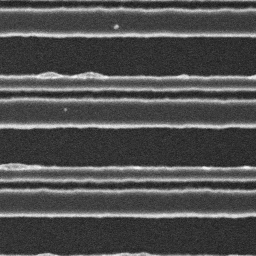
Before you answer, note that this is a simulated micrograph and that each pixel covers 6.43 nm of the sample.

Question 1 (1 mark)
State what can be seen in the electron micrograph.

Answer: lines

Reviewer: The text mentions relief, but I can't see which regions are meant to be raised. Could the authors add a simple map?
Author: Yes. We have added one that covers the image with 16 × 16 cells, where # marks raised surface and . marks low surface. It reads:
################
################
................
................
................
################
################
################
................
................
####....#...##.#
################
################
..............#.
................
................